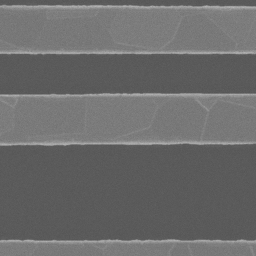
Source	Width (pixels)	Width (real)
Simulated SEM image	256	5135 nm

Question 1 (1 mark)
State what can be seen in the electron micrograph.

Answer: lines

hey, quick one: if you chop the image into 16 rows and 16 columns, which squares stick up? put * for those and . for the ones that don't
****************
****************
****************
................
................
................
****************
****************
****************
................
................
................
................
................
................
****************